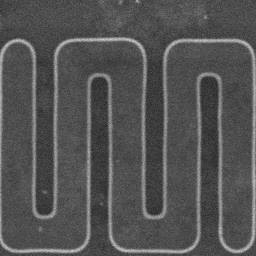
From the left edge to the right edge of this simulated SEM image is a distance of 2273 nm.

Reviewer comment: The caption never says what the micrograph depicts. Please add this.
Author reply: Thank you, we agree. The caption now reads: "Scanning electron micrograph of groups of lines, slits or small figures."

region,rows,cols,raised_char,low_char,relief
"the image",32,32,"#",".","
................................
................................
................................
................................
................................
.##.....#########.....#########.
####...###########...###########
####...###########...###########
####...###########...###########
####...#####.#####...####..#####
####...####...####...####..#####
####...####...####...####...####
####...####...####...####...####
####...####...####...####..#####
####...####...####...####..#####
####...####...####...####..#####
####...####...####...####..#####
####...####...####...####...####
####...####...####...####...####
####...####...####...####...####
####...####...####...####...####
####...####...####...####...####
####...####...####...####...####
####...####...####...####...####
####...####...####...####...####
####...####...####...####...####
####...####...####..#####...####
###########...###########...####
###########...###########...####
###########...###########...####
###########...##########....###.
................................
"